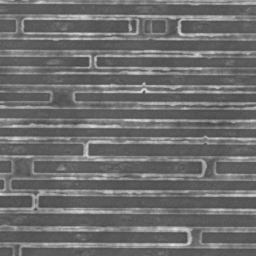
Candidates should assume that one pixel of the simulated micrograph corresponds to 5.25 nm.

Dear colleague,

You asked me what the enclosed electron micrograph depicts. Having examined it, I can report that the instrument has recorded parallel lines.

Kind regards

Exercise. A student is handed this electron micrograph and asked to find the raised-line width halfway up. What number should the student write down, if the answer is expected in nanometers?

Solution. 33.5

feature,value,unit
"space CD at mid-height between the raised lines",10.7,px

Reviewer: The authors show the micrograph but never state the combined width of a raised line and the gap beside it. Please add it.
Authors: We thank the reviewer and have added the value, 92 nanometers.